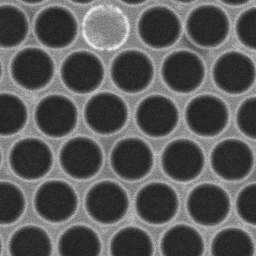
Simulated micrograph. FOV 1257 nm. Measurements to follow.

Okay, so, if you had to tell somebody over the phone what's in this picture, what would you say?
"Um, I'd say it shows a regular array of holes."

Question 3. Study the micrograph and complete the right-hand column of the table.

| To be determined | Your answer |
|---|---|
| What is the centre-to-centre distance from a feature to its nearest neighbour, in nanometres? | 242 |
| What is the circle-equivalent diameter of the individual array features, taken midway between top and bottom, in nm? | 195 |